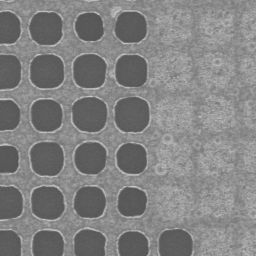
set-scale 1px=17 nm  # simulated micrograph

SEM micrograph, a regular array of holes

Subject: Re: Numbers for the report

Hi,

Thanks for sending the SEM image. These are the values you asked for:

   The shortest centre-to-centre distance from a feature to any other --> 0.714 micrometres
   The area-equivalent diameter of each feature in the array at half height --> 0.584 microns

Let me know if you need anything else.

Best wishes